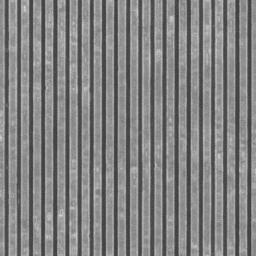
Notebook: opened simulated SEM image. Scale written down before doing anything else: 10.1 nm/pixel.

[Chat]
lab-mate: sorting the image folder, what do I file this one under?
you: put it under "parallel lines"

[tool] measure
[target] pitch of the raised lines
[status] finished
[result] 122 nanometers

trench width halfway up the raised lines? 40.4 nanometers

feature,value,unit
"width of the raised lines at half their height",80.8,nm